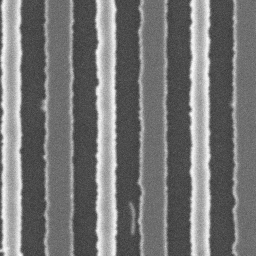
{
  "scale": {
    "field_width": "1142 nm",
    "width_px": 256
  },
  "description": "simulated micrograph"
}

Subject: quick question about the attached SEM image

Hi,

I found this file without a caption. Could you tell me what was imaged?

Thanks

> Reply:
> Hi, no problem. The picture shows lines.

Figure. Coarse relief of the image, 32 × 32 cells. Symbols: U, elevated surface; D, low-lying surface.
UUUDDDUUUDDDUUDDDDUUUDDDUUDDDUUU
UUDDDDUUUDDDUUDDDDUUUDDDUUDDDUUU
UUUDDDUUUDDDUUDDDDUUUDDDUUDDDUUU
UUDDDDUUUDDDUUDDDDUUUDDDUUDDDUUU
UUUDDDUUUDDDUUDDDUUUUDDDUUDDDUUU
UUUDDDUUUDDDUUDDDDUUUDDDUUDDDUUU
UUUDDDUUUDDDUUDDDDUUUDDDUUDDDUUU
UUUDDDUUUDDDUUDDDDUUUDDDUUDDDUUU
UUDDDDUUUDDDUUDDDDUUUDDDUUDDDUUU
UUUDDDUUUDDDUUDDDUUUUDDDUUDDDUUU
UUUDDDUUUDDDUUDDDUUUUDDDUUDDDUUU
UUUDDDUUUDDDUUDDDDUUUDDDUUDDDUUU
UUUDDDUUUDDDUUDDDDUUUDDDUUDDDUUU
UUDDDDUUUDDDUUDDDDUUUDDDUUDDDUUU
UUDDDDUUUDDDUUDDDDUUUDDDUUDDDUUU
UUUDDDUUUDDDUUDDDDUUUDDDUUDDDUUU
UUUDDDUUUDDDUUDDDDUUUDDDUUDDDUUU
UUUDDDUUUDDDUUDDDDUUUDDDUUDDDUUU
UUDDDDUUUDDDUUDDDDUUUDDDUUDDDUUU
UUUDDDUUUDDDUUDDDDUUUDDDUUDDDUUU
UUUDDDUUUDDDUUUDDDUUUDDDUUDDDUUU
UUUDDDUUUDDDUUDDDDUUUDDDUUDDDUUU
UUUDDDUUUDDDUUDDDUUUUDDDUUDDDUUU
UUUDDDUUUDDDUUDDDDUUUDDDUUDDDUUU
UUUDDDUUUDDDUUDDDDUUUDDDUUDDDUUU
UUUDDDUUUDDDUUDDDDUUUDDDUUDDDUUU
UUUDDDUUUDDDUUUDDDUUUDDDUUDDDUUU
UUUDDDUUUDDDUUUDDUUUUDDDUUDDDUUU
UUUDDDUUUDDDUUUDDDUUUDDDUUDDDUUU
UUUDDDUUUDDDUUDDDDUUUDDDUUDDDUUU
UUUDDDUUUDDDUUDDDDUUUDDDUUDDDUUU
UUUDDDUUUDDDUUDDDDUUUDDDUUDDDUUU